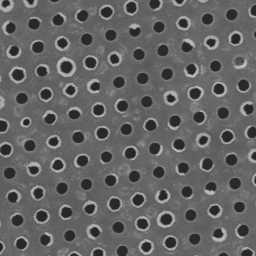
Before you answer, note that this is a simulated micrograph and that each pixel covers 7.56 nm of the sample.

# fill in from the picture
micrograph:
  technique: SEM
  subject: a regular array of holes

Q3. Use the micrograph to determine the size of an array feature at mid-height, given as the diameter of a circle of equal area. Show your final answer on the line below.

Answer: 81.4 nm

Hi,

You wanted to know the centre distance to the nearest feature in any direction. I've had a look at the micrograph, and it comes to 0.179 µm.